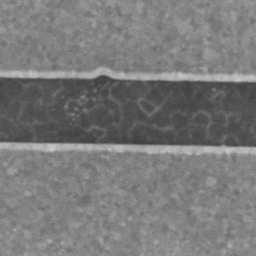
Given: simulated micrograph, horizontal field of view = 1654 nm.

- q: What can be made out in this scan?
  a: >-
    one or a few lines or trenches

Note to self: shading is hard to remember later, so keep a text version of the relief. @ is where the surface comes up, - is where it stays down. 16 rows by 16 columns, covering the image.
@@@@@@@@@@@@@@@@
@@@@@@@@@@@@@@@@
@@@@@@@@@@@@@@@@
@@@@@@@@@@@@@@@@
@@@@@@@@@@@@@@@@
----------------
----------------
----------------
----------------
@@@@@@@@@@@@@@@@
@@@@@@@@@@@@@@@@
@@@@@@@@@@@@@@@@
@@@@@@@@@@@@@@@@
@@@@@@@@@@@@@@@@
@@@@@@@@@@@@@@@@
@@@@@@@@@@@@@@@@